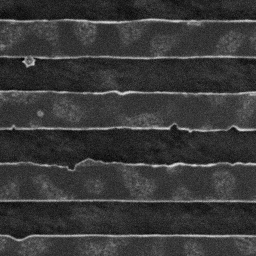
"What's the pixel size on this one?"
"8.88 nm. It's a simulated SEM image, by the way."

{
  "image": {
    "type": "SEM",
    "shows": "one or a few lines or trenches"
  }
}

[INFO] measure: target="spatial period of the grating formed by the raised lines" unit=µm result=0.635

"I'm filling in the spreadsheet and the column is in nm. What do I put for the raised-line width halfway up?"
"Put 333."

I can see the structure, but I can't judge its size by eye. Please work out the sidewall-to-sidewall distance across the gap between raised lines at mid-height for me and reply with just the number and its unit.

301 nm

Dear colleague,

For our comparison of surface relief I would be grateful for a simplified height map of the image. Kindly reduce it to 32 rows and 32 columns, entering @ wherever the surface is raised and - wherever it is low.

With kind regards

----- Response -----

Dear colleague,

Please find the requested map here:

--------------------------------
--------------------------------
@------@@@----------------------
@@@@@@@@@@@@@@@@@@@@@@@@@@@@@@@@
@@@@@@@@@@@@@@@@@@@@@@@@@@@@@@@@
@@@@@@@@@@@@@@@@@@@@@@@@@@@@@@@@
@@@@@@@@@@@@@@@@@@@@@@@@@@@@@@@@
---@----------------------------
--------------------------------
--------------------------------
--------------------------------
@@@@@@@-------------------------
@@@@@@@@@@@@@@@@@@@@@@@@@@@@@@@@
@@@@@@@@@@@@@@@@@@@@@@@@@@@@@@@@
@@@@@@@@@@@@@@@@@@@@@@@@@@@@@@@@
@@@@@@@@@@@@@@@@@@@@@@@@@@@@@@@@
--------------------------------
--------------------------------
--------------------------------
--------------------------------
@@@@------@@@@@@------@----@@@@-
@@@@@@@@@@@@@@@@@@@@@@@@@@@@@@@@
@@@@@@@@@@@@@@@@@@@@@@@@@@@@@@@@
@@@@@@@@@@@@@@@@@@@@@@@@@@@@@@@@
@@@@@@@@@@@@@@@@@@@@@@@@@@@@@@@@
--------------------------------
--------------------------------
--------------------------------
--------------------------------
@---@@--@@@@@@@@@@@@@@@---------
@@@@@@@@@@@@@@@@@@@@@@@@@@@@@@@@
@@@@@@@@@@@@@@@@@@@@@@@@@@@@@@@@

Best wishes